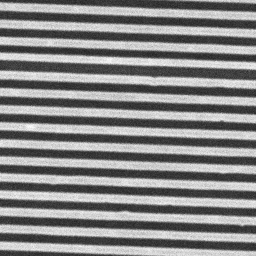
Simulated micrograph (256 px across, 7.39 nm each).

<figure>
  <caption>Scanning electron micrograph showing parallel lines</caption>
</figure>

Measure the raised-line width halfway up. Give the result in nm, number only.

57.2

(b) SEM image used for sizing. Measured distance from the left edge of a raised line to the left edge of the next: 126 nanometers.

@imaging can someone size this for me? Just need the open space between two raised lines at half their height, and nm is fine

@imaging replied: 69.2